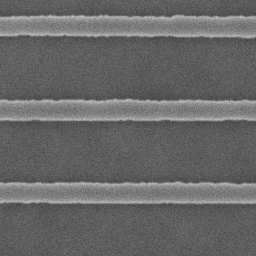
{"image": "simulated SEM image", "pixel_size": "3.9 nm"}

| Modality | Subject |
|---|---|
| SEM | lines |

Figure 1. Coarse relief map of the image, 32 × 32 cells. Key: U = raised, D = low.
DDDDDDDDDDDDDDDDDDDDDDDDDDDDDDDD
DDDDDDDDDDDDDDDDDDDDDDDDDDDDDDDD
UUUUUUUUUUUUUUUUUUUUUUUUUUUUUUUU
UUUUUUUUUUUUUUUUUUUUUUUUUUUUUUUU
DDDDDDDDDDUUUUDDUUUUUUUUUUUUUUUU
DDDDDDDDDDDDDDDDDDDDDDDDDDDDDDDD
DDDDDDDDDDDDDDDDDDDDDDDDDDDDDDDD
DDDDDDDDDDDDDDDDDDDDDDDDDDDDDDDD
DDDDDDDDDDDDDDDDDDDDDDDDDDDDDDDD
DDDDDDDDDDDDDDDDDDDDDDDDDDDDDDDD
DDDDDDDDDDDDDDDDDDDDDDDDDDDDDDDD
DDDDDDDDDDDDDDDDDDDDDDDDDDDDDDDD
DDDDDDDDDDDDDDUUUDDDDDDDDDDDDDDD
UUUUUUUUUUUUUUUUUUUUUUUUUUUUUUUU
UUUUUUUUUUUUUUUUUUUUUUUUUUUUUUUU
DDDDDDDDDDDDDDDDDDDDDDDDDDDDDDDD
DDDDDDDDDDDDDDDDDDDDDDDDDDDDDDDD
DDDDDDDDDDDDDDDDDDDDDDDDDDDDDDDD
DDDDDDDDDDDDDDDDDDDDDDDDDDDDDDDD
DDDDDDDDDDDDDDDDDDDDDDDDDDDDDDDD
DDDDDDDDDDDDDDDDDDDDDDDDDDDDDDDD
DDDDDDDDDDDDDDDDDDDDDDDDDDDDDDDD
DDDDDDDDDDDDDDDDDDDDDDDDDDDDDDDD
UUUUUUUUUUUUUUUUUUUUUUUUUUUUUUUU
UUUUUUUUUUUUUUUUUUUUUUUUUUUUUUUU
DDDDDDDDDDDDDDDDDDDDDDDDDDDDDDDD
DDDDDDDDDDDDDDDDDDDDDDDDDDDDDDDD
DDDDDDDDDDDDDDDDDDDDDDDDDDDDDDDD
DDDDDDDDDDDDDDDDDDDDDDDDDDDDDDDD
DDDDDDDDDDDDDDDDDDDDDDDDDDDDDDDD
DDDDDDDDDDDDDDDDDDDDDDDDDDDDDDDD
DDDDDDDDDDDDDDDDDDDDDDDDDDDDDDDD